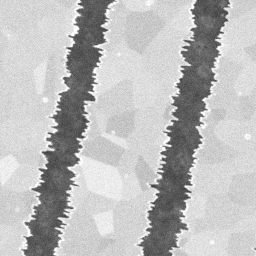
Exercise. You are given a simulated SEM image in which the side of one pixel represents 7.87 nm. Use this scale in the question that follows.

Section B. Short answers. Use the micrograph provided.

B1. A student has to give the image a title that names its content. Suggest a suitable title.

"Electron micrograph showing one or a few lines or trenches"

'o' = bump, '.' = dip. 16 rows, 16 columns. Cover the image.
ooooo..ooooo..oo
ooooo..ooooo..oo
ooooo.oooooo..oo
oooo..ooooo...oo
oooo..ooooo..ooo
oooo..ooooo..ooo
oooo..ooooo..ooo
ooo..oooooo..ooo
ooo..ooooo...ooo
ooo..ooooo..oooo
ooo..ooooo..oooo
oo...ooooo..oooo
oo..oooooo..oooo
oo..ooooo..ooooo
oo..ooooo..ooooo
oo..ooooo..ooooo